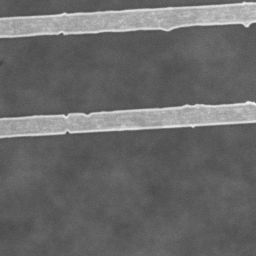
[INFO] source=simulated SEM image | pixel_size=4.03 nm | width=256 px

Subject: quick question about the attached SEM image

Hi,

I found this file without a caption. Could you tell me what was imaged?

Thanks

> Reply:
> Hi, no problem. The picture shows one or a few lines or trenches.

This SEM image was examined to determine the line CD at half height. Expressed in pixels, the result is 17.8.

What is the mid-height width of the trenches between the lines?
0.329 micrometres